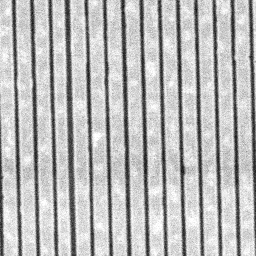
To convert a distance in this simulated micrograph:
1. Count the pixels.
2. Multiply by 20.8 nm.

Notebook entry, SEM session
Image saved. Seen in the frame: parallel lines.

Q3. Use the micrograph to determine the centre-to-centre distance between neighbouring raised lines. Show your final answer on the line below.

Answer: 18.2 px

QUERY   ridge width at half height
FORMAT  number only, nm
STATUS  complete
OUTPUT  264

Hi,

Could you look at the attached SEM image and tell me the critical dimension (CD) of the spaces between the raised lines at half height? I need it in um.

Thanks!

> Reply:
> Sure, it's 0.122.